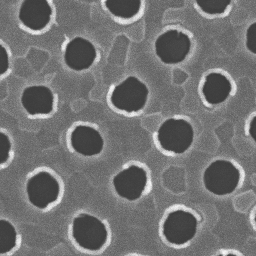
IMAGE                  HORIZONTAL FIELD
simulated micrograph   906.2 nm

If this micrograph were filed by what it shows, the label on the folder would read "a regular array of holes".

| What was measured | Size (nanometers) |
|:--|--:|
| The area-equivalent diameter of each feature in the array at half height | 118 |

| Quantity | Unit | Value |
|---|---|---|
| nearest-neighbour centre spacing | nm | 218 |